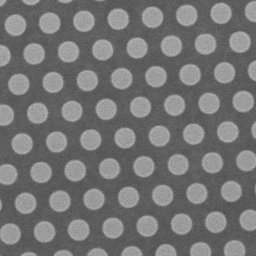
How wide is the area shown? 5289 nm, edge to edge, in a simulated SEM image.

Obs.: an array of small figures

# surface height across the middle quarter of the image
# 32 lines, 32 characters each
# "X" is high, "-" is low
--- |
------------------------------XX
-------------XXX-----XXXX----XXX
----XXXX----XXXXX----XXXX----XXX
---XXXXX----XXXXX----XXXX----XXX
---XXXXX----XXXXX----XXXX-----XX
----XXXX-----XXX------XX--------
-----XX-------------------------
--------------------------------
------------------XX------XXX---
-XX------XXX-----XXXX----XXXXX--
XXXX----XXXXX----XXXXX---XXXXX--
XXXX----XXXXX----XXXXX---XXXXX--
XXXX----XXXXX----XXXX-----XXX---
XXXX-----XXX--------------------
--------------------------------
-------------------------------X
--------------XXX-----XXXX----XX
-----XXXX----XXXX----XXXXX----XX
----XXXXX----XXXXX---XXXXX----XX
X---XXXXX----XXXXX----XXXX-----X
-----XXXX-----XXX---------------
--------------------------------
--------------------------------
-------------------XX------XXX--
-XXX------XXX-----XXXX----XXXXX-
-XXXX----XXXXX---XXXXX----XXXXX-
XXXXX----XXXXX----XXXX----XXXXX-
XXXXX----XXXX-----XXXX-----XX---
-XXXX-----XX--------------------
--------------------------------
------------------------X-------
-------X------XXXX----XXXXX----X